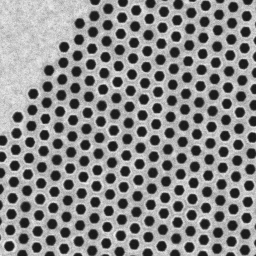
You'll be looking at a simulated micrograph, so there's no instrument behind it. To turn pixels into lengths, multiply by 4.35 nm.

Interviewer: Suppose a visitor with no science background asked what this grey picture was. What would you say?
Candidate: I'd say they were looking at a regular array of holes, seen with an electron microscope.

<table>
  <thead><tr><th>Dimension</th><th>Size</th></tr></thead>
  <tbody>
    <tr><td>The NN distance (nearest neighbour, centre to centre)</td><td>68.4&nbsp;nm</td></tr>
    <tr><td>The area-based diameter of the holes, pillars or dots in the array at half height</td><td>46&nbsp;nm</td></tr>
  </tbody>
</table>